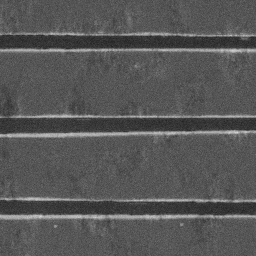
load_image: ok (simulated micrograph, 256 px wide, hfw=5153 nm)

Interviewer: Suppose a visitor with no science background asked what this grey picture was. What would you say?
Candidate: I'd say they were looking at lines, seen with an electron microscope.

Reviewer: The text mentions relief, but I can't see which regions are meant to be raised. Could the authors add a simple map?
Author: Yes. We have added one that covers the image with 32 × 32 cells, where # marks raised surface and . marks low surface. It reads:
################################
################################
################################
################################
................................
................................
################################
################################
################################
################################
################################
################################
################################
################################
################################
................................
...............................#
################################
################################
################################
################################
################################
################################
################################
################################
................................
................................
################################
################################
################################
################################
################################